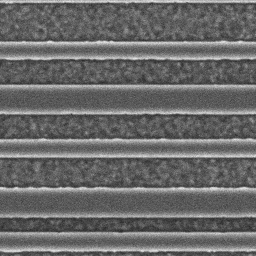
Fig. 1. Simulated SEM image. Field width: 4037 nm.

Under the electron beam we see lines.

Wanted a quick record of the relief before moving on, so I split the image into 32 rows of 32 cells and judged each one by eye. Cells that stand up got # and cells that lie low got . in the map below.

................................
................................
................................
................................
................................
################################
################################
................................
................................
................................
................................
################################
################################
################################
................................
................................
................................
################################
################################
################################
................................
................................
................................
######.#######..##...##.####..#.
################################
################################
################################
................................
................................
################################
################################
................................